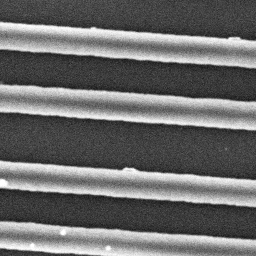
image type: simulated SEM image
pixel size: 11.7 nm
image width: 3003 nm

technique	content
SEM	lines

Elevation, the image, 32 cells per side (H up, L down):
LLLLLLLLLLLLLLLLLLLLLLLLLLLLLLLL
LLLLLLLLLLLLLLLLLLLLLLLLLLLLLLLL
LLLLLLLLLLLLLLLLLLLLLLLLLLLLLLLL
HHHHHHLLLLLLLLLLLLLLLLLLLLLLLLLL
HHHHHHHHHHHHHHHHHHHHLLLLLLLLLLLL
HHHHHHHHHHHHHHHHHHHHHHHHHHHHHHHH
LLLLLLLLHHHHHHHHHHHHHHHHHHHHHHHH
LLLLLLLLLLLLLLLLLLLLHHHHHHHHHHHH
LLLLLLLLLLLLLLLLLLLLLLLLLLLLLLLL
LLLLLLLLLLLLLLLLLLLLLLLLLLLLLLLL
LLLLLLLLLLLLLLLLLLLLLLLLLLLLLLLL
HHHHHHHHHLLLLLLLLLLLLLLLLLLLLLLL
HHHHHHHHHHHHHHHHHHHHHHHLLLLLLLLL
HHHHHHHHHHHHHHHHHHHHHHHHHHHHHHHH
LLLLLLLLLLHHHHHHHHHHHHHHHHHHHHHH
LLLLLLLLLLLLLLLLLLLLLLLLHHHHHHHH
LLLLLLLLLLLLLLLLLLLLLLLLLLLLLLLL
LLLLLLLLLLLLLLLLLLLLLLLLLLLLLLLL
LLLLLLLLLLLLLLLLLLLLLLLLLLLLLLLL
LLLLLLLLLLLLLLLLLLLLLLLLLLLLLLLL
HLLLLLLLLLLLLLLLLLLLLLLLLLLLLLLL
HHHHHHHHHHHHHHHHLLLLLLLLLLLLLLLL
HHHHHHHHHHHHHHHHHHHHHHHHHHHHHLLL
LLHHHHHHHHHHHHHHHHHHHHHHHHHHHHHH
LLLLLLLLLLLLLLLLHHHHHHHHHHHHHHHH
LLLLLLLLLLLLLLLLLLLLLLLLLLLLLHHH
LLLLLLLLLLLLLLLLLLLLLLLLLLLLLLLL
LLLLLLLLLLLLLLLLLLLLLLLLLLLLLLLL
HHHHHHHLLLLLLLLLLLLLLLLLLLLLLLLL
HHHHHHHHHHHHHHHHHHHHHLLLLLLLLLLL
HHHHHHHHHHHHHHHHHHHHHHHHHHHHHHHH
LLLLLLLLLLHHHHHHHHHHHHHHHHHHHHHH